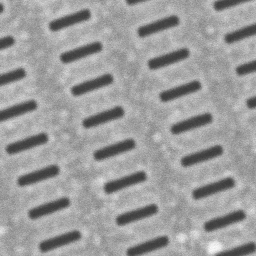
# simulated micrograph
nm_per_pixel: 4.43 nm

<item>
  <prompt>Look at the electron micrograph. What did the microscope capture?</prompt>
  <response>a regular array of holes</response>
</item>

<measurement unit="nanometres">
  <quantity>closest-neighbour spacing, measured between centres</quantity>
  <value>151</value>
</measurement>